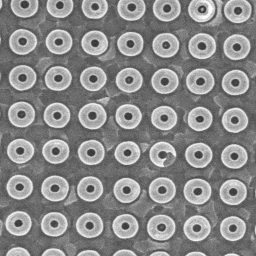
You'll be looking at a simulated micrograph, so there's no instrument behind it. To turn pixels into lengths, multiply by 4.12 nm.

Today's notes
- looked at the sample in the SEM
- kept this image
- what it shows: a regular array of ring-shaped raised bodies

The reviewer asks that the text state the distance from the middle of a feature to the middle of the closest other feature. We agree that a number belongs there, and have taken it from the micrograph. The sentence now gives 146 nanometres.